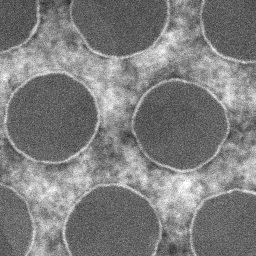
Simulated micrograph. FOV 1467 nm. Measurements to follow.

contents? raised bodies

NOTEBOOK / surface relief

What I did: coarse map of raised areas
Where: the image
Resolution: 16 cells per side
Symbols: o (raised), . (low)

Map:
oo..ooooooo..ooo
oo...ooooo...ooo
oo...ooooo...ooo
.......o......oo
................
.oooo.....ooo...
oooooo...ooooo..
oooooo..oooooo..
.ooooo..oooooo..
.oooo....ooooo..
...........o....
................
oo...oooo....ooo
oo..oooooo..oooo
oo..oooooo..oooo
oo..oooooo..oooo